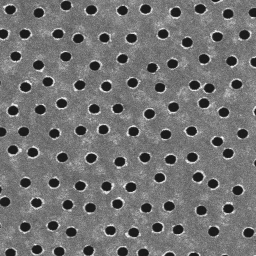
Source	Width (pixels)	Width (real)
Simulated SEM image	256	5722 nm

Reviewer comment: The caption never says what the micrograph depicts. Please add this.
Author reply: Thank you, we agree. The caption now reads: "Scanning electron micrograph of a regular array of holes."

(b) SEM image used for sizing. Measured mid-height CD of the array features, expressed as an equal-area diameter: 230 nanometers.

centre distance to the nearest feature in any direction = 516 nanometers